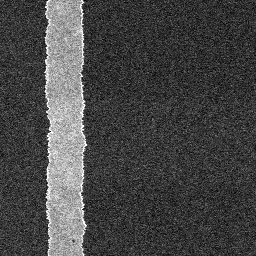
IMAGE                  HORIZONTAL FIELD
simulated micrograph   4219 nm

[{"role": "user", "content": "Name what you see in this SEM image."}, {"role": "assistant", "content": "one or a few lines or trenches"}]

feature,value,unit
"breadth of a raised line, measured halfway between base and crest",566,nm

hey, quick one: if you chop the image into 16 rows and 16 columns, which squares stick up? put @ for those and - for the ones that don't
---@@-----------
---@@-----------
---@@-----------
---@@-----------
---@@-----------
---@@-----------
---@@-----------
---@@-----------
---@@-----------
---@@-----------
---@@-----------
---@@-----------
---@@-----------
---@@-----------
---@@-----------
---@@-----------